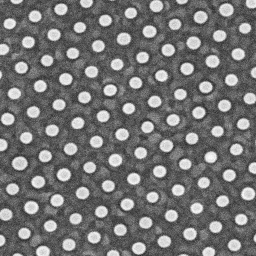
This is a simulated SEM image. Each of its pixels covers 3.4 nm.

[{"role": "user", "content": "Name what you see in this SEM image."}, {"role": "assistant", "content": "a regular array of raised bodies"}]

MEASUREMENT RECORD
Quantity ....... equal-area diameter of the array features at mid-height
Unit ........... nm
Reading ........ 38.7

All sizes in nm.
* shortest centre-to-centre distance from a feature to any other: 89